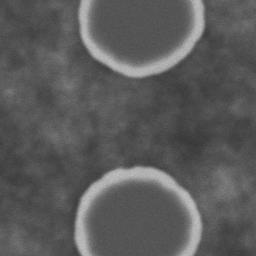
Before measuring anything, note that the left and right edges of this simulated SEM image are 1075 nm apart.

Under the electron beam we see raised bodies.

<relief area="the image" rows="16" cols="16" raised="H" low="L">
LLLLLHHHHHHHLLLL
LLLLLHHHHHHHHLLL
LLLLLHHHHHHHLLLL
LLLLLLHHHHHLLLLL
LLLLLLLLLLLLLLLL
LLLLLLLLLLLLLLLL
LLLLLLLLLLLLLLLL
LLLLLLLLLLLLLLLL
LLLLLLLLLLLLLLLL
LLLLLLLLLLLLLLLL
LLLLLLLLLLLLLLLL
LLLLLLHHHHHLLLLL
LLLLLHHHHHHHLLLL
LLLLLHHHHHHHLLLL
LLLLLHHHHHHHLLLL
LLLLLHHHHHHHLLLL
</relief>